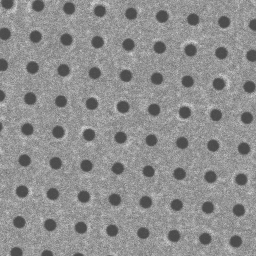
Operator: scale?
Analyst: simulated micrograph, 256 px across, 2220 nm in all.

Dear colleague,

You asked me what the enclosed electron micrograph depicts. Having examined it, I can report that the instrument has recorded a regular array of holes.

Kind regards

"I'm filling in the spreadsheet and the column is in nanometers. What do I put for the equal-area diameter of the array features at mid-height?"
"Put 107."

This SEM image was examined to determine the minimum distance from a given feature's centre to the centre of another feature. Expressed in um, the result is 0.267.